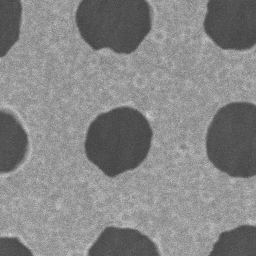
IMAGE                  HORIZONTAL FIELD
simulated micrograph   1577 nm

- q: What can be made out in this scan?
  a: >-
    holes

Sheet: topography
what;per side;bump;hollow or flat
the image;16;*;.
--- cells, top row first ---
.****....****...
.****....****...
.****....****...
****************
****************
****************
**************..
.*****...****...
..***.....***...
..***....****...
.*****..******..
****************
****************
****************
******...*****..
..****....***...